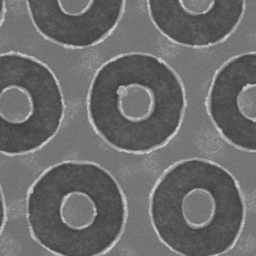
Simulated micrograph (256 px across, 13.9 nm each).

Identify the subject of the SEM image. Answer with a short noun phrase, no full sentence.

ring-shaped grooves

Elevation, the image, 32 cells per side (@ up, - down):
@@@@---@@@@----@@@@----@@@@---@@
@@@@----@@-----@@@@-----@@----@@
@@@@-----------@@@@-----------@@
@@@@@---------@@@@@@---------@@@
@@@@@@-------@@@@@@@@-------@@@@
@@@@@@@@---@@@@@@@@@@@@---@@@@@@
@@@@@@@@@@@@@@@@@@@@@@@@@@@@@@@@
----@@@@@@@@@@------@@@@@@@@@---
------@@@@@@@--------@@@@@@@----
-------@@@@@----------@@@@@-----
-------@@@@@-----------@@@@-----
@@@----@@@@----@@@@----@@@----@@
@@@@----@@@----@@@@----@@@----@@
@@@@----@@@----@@@@----@@@----@@
@@@@----@@@----@@@-----@@@-----@
-------@@@@@----------@@@@@-----
-------@@@@@----------@@@@@@----
------@@@@@@@--------@@@@@@@@---
----@@@@@@@@@@@----@@@@@@@@@@@--
@@@@@@@@@@@@@@@@@@@@@@@@@@@@@@@@
@@@@@@@@----@@@@@@@@@@-----@@@@@
@@@@@@-------@@@@@@@@-------@@@@
@@@@@---------@@@@@@---------@@@
@@@@-----------@@@@@----------@@
@@@@----@@@----@@@@----@@@----@@
@@@@----@@@@---@@@@----@@@@---@@
@@@@----@@@@----@@@----@@@@---@@
@@@@----@@@@---@@@@----@@@----@@
@@@@-----@-----@@@@-----------@@
@@@@-----------@@@@@----------@@
@@@@@---------@@@@@@@--------@@@
@@@@@@@------@@@@@@@@@------@@@@